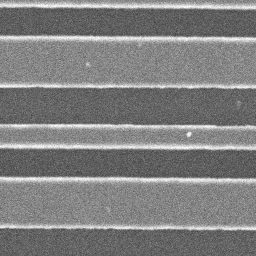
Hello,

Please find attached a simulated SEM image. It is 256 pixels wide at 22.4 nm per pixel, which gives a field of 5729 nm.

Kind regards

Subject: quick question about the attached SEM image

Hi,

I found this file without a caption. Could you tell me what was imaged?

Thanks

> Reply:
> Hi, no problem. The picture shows lines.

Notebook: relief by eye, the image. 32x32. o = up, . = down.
oooooooooooooooooooooooooooooooo
................................
................................
................................
................................
oooooooooooooooooooooooooooooooo
oooooooooooooooooooooooooooooooo
oooooooooooooooooooooooooooooooo
oooooooooooooooooooooooooooooooo
oooooooooooooooooooooooooooooooo
oooooooooooooooooooooooooooooooo
................................
................................
................................
................................
................................
oooooooooooooooooooooooooooooooo
oooooooooooooooooooooooooooooooo
................................
................................
................................
................................
ooooooooooooooooooooooooooo.....
oooooooooooooooooooooooooooooooo
oooooooooooooooooooooooooooooooo
oooooooooooooooooooooooooooooooo
oooooooooooooooooooooooooooooooo
oooooooooooooooooooooooooooooooo
......o......ooooooooooooooooooo
................................
................................
................................